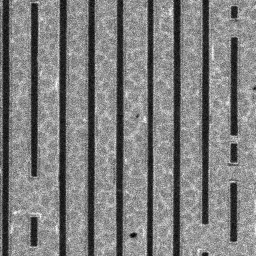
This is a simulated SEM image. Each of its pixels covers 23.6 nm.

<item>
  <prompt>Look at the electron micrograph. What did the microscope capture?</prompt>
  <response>parallel lines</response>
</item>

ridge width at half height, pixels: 8.63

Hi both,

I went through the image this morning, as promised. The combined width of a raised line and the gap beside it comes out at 674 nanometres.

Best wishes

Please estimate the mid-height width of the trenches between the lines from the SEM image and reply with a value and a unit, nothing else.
476 nm